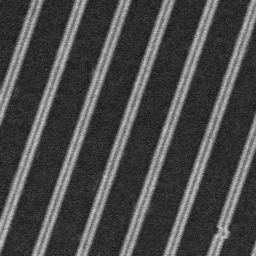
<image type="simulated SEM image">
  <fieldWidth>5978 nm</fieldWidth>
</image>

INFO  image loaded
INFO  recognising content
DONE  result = parallel lines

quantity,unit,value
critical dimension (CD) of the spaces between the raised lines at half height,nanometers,759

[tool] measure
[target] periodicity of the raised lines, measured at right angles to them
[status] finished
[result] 968 nanometres